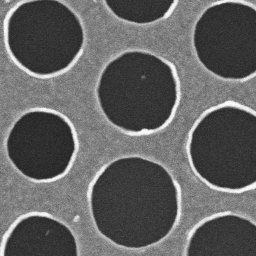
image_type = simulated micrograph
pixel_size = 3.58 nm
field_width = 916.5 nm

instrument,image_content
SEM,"holes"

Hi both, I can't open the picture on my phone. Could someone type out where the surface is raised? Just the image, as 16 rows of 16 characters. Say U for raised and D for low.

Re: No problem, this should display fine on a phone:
UDDDUUUDDDDUUDDD
UDDDDUUUUUUUDDDD
UDDDDUUUUUUUDDDD
UDDDDUUUDDUUDDDD
UUDUUUDDDDDUUDDD
UUUUUUDDDDDUUUUU
UUUUUUDDDDDUUUUU
UDDDUUUDDDUUUDDD
UDDDDUUUUUUUDDDD
UDDDDUUUUUUUDDDD
UDDDUUUDDDUUDDDD
UUUUUUDDDDDUUDDD
UUUUUUDDDDDUUUUU
UUUUUUDDDDDUUUDU
UDDDUUDDDDDUDDDD
DDDDDUUUUUUUDDDD